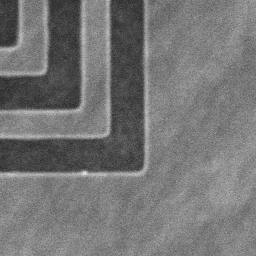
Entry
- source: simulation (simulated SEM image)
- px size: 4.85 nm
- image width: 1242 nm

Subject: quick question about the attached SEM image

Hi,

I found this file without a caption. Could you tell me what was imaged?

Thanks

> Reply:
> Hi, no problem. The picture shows groups of lines, slits or small figures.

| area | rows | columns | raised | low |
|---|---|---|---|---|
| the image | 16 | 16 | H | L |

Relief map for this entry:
LHHLLHHLLHHHHHHH
LHHLLHHLLHHHHHHH
LHHLLHHLLHHHHHHH
HHHLLHHLLHHHHHHH
HHHLLHHLLHHHHHHH
LLLLLHHLLHHHHHHH
LLLLLHHLLHHHHHHH
HHHHHHHLLHHHHHHH
HHHHHHLLLHHHHHHH
LLLLLLLLLHHHHHHH
LLLLLLLLLHHHHHHH
HHHHHHHHHHHHHHHH
HHHHHHHHHHHHHHHH
HHHHHHHHHHHHHHHH
HHHHHHHHHHHHHHHH
HHHHHHHHHHHHHHHH